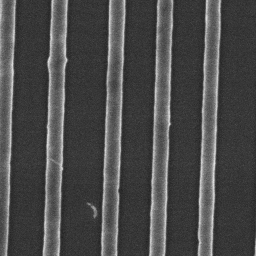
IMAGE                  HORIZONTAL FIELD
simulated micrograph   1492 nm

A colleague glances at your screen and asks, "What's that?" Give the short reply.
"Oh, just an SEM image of parallel lines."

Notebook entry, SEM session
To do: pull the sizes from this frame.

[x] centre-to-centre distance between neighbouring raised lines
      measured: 299 nanometers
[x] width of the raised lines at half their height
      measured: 88.2 nanometers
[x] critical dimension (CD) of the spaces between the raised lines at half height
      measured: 0.204 microns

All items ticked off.